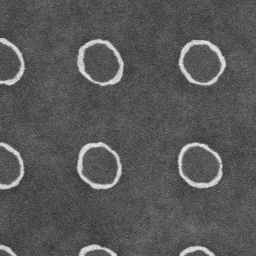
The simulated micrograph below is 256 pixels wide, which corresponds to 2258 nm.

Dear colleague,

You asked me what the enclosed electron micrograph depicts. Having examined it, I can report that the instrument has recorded raised bodies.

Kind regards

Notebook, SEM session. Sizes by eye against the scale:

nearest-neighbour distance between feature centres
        892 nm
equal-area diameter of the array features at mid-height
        0.372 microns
